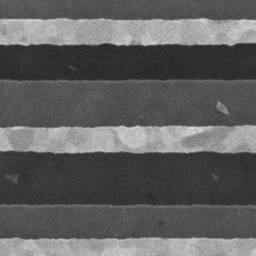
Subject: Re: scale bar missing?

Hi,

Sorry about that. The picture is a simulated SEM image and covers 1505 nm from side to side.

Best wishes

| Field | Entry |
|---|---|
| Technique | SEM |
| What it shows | lines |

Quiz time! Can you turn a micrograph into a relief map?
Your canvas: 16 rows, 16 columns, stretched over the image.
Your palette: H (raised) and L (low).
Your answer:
HHHHHHHHHHHHHHHH
HHHHHHHHHHHHHHHH
HHHHHHHHHHHHHHHH
LLLLLLLLLLLLLLLL
LLLLLLLLLLLLLLLL
HHHHHHHHHHHHHHHH
HHHHHHHHHHHHHHHH
HHHHHHHHHHHHHHHH
HHHHHHHHHHHHHHHH
LLLHHLLLHLHHLLHL
LLLLLLLLLLLLLLLL
LLLLLLLLLLLLLLLL
LLLLLLLLLLLLLLLL
HHHHHHHHHHHHHHHH
HHHHHHHHHHHHHHHH
HHHHHHHHHHHHHHHH